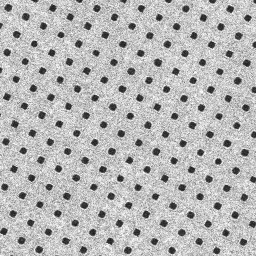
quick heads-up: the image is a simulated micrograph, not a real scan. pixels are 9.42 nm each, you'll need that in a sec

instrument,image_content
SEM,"a regular array of holes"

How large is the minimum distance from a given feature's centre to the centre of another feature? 185 nm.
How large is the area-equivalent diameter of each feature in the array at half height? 71.3 nm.